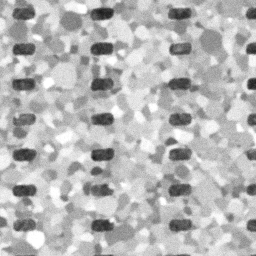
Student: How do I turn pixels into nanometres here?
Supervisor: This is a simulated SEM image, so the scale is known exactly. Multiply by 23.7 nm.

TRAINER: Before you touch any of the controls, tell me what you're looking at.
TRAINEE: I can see a regular array of holes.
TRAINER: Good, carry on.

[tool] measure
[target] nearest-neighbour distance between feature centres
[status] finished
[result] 830 nm